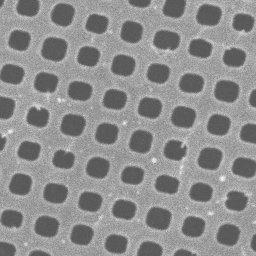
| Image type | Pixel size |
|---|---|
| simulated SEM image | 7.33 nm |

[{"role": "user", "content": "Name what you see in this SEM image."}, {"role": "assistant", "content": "a regular array of holes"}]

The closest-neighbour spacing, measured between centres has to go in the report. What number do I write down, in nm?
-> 255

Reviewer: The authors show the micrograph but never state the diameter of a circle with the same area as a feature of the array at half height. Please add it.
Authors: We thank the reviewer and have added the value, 167 nanometers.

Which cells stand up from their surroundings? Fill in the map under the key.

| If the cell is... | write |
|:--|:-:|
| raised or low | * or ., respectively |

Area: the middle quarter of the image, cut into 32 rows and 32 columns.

******..****......***.....******
************......***.....******
************.....****.....****..
*********************.....***...
**...*****************...****...
*......**********************...
*......****..****************...
*......***.....*****************
**....****......****..**********
**********.....****.....********
**********.....****.....********
******************......***.....
*.*****************.....***.....
.....****************..****.....
......*********************.....
.....***.....***************....
.....***......******************
....****......***.....**********
********.....****.....**********
*********....***......****...***
****************......***.....**
*****************....****......*
..***********************.....**
...****...****************....**
...***.....*********************
..****......****.***************
******.....****.....************
******.....***......************
*********.****......***.....****
***************....****......***
***********************......***
.**********************.....****